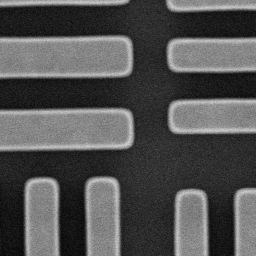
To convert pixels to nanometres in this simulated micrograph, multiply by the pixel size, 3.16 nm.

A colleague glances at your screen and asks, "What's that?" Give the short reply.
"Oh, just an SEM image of groups of lines, slits or small figures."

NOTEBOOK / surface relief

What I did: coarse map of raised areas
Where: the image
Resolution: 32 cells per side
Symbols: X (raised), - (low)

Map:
XXXXXXXXXXXXXX-------XXXXXXXXXXX
--------------------------------
--------------------------------
--------------------------------
--------------------------------
XXXXXXXXXXXXXXXX-----XXXXXXXXXXX
XXXXXXXXXXXXXXXX-----XXXXXXXXXXX
XXXXXXXXXXXXXXXX-----XXXXXXXXXXX
XXXXXXXXXXXXXXXX-----XXXXXXXXXXX
XXXXXXXXXXXXXXX-----------------
--------------------------------
--------------------------------
---------------------------XXXXX
---------------------XXXXXXXXXXX
XXXXXXXXXXXXXXXX-----XXXXXXXXXXX
XXXXXXXXXXXXXXXXX----XXXXXXXXXXX
XXXXXXXXXXXXXXXXX-----XXXXXXXXXX
XXXXXXXXXXXXXXXXX---------------
XXXXXXXXXXXX--------------------
--------------------------------
--------------------------------
--------------------------------
----XXX----XXX------------------
---XXXX----XXXX-----------------
---XXXX----XXXX-------XXXX----XX
---XXXX----XXXX-------XXXX---XXX
---XXXX----XXXX-------XXXX---XXX
---XXXX----XXXX-------XXXX---XXX
---XXXX----XXXX-------XXXX----XX
---XXXX----XXXX-------XXXX----XX
---XXXX----XXXX-------XXXX----XX
---XXXX----XXXX-------XXXX----XX